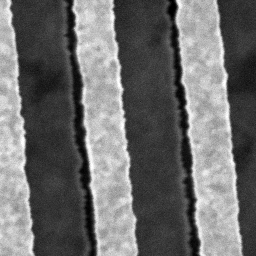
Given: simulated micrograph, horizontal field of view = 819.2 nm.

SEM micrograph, lines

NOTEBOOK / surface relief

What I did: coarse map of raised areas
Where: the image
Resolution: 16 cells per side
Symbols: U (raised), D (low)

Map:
UDDDDUUDDDDUUUDD
UDDDDUUDDDDUUUDD
UDDDDUUDDDDUUUDD
UDDDDUUDDDDUUUDD
UDDDDUUDDDDUUUDD
UDDDDUUUDDDDUUDD
UDDDDUUUDDDDUUDD
UDDDDUUUDDDDUUDD
UUDDDUUUDDDDUUDD
UUDDDUUUDDDDUUUD
UUDDDDUUDDDDUUUD
UUDDDDUUDDDDUUUD
UUDDDDUUDDDDUUUD
UUDDDDUUDDDDUUUD
UUDDDDUUDDDDUUUD
UUDDDDUUUDDDDUUD